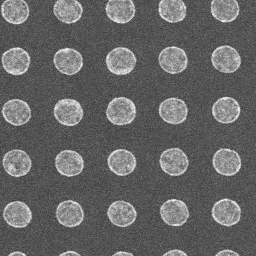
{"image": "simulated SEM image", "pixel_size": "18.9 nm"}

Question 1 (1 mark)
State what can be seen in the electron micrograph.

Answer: a regular array of raised bodies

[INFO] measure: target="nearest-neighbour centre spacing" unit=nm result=960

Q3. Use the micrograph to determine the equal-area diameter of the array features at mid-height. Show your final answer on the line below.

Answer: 0.508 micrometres